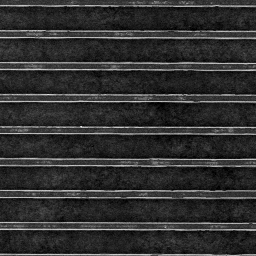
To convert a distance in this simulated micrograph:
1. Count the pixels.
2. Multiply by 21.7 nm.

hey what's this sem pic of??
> parallel lines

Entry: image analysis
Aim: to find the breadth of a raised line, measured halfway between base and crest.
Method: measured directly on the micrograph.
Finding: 7.13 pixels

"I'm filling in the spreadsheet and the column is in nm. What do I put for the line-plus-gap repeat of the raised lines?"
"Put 694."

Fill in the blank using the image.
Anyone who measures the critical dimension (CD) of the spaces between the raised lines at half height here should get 545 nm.